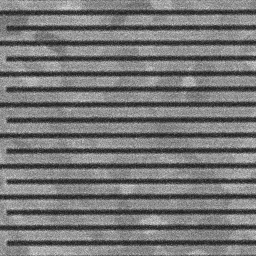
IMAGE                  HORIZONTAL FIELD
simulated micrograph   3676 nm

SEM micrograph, parallel lines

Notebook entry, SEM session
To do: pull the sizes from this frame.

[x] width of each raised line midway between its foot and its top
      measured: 131 nm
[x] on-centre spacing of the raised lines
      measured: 220 nanometers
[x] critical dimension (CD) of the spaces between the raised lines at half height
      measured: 89.7 nanometers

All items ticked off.